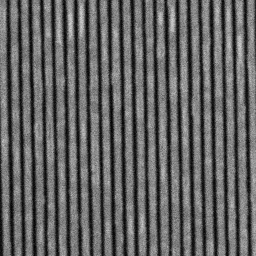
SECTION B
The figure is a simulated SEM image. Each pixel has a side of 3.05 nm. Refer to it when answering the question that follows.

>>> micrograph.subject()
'parallel lines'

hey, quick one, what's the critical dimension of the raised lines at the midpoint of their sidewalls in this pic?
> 22.1 nm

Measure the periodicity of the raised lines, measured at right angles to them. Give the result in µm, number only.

0.0345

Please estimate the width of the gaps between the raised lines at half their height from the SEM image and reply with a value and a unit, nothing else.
11.1 nm